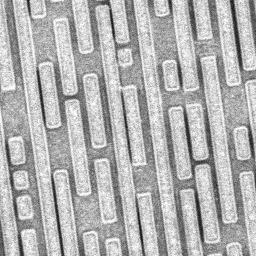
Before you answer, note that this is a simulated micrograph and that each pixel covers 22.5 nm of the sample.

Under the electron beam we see parallel lines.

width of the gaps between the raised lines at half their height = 0.176 µm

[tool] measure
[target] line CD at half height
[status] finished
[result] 307 nm